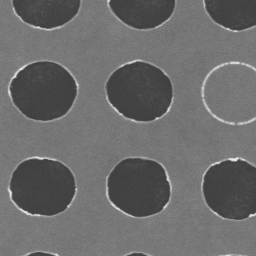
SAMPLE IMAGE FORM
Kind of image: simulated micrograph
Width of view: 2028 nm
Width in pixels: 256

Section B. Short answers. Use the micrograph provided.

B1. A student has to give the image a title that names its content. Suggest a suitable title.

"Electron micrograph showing holes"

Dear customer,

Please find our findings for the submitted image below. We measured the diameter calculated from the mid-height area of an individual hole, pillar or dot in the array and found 491 nm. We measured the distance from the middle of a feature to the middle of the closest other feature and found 759 nanometres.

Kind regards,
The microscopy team